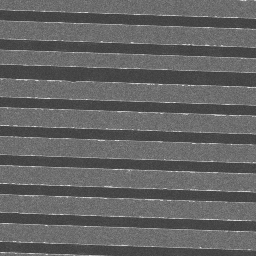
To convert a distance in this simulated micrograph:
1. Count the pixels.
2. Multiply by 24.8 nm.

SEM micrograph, parallel lines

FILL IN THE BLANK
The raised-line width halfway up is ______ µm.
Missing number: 0.458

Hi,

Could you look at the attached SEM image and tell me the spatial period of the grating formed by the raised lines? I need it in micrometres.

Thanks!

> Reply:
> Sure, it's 0.717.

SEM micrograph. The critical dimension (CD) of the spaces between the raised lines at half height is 254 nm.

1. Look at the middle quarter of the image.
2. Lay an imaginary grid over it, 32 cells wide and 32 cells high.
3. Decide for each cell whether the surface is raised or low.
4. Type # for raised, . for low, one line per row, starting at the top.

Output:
################################
............................####
................................
................................
##.####.........................
################################
################################
################################
################################
.......................#########
................................
................................
##############################..
################################
################################
################################
..................##############
..................#.............
................................
#########################.......
################################
################################
################################
..........######################
................................
................................
################................
################################
################################
################################
.....###########################
................................